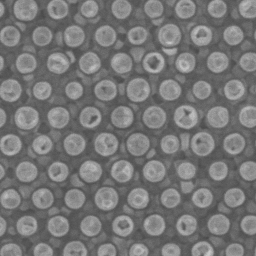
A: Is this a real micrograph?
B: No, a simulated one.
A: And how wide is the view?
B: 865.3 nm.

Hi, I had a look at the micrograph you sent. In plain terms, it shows a regular array of raised bodies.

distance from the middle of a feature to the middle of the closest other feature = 105 nm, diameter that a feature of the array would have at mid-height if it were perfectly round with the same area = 0.065 µm